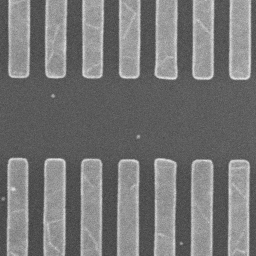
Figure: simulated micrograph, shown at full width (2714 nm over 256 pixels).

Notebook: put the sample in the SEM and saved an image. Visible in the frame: wiring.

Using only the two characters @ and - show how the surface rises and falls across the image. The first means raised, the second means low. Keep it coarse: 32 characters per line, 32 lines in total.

-@@@--@@--@@@--@@---@@--@@@--@@-
-@@@--@@--@@@--@@---@@--@@@--@@-
-@@@--@@--@@@--@@---@@--@@@--@@-
-@@@--@@--@@@--@@---@@--@@@--@@-
-@@@--@@--@@@--@@---@@--@@@--@@-
-@@@--@@--@@@--@@---@@--@@@--@@-
-@@@--@@--@@@--@@---@@--@@@--@@-
-@@@--@@--@@@--@@---@@--@@@--@@-
-@@@--@@--@@@--@@--@@@--@@@--@@-
--@---@@---@---@@---@@--@@---@@-
--------------------------------
--------------------------------
--------------------------------
--------------------------------
--------------------------------
--------------------------------
--------------------------------
--------------------------------
--------------------------------
--------------------------------
-@@---@@--@@@--@@--@@@--@@---@@-
-@@---@@--@@@--@@--@@@--@@@--@@-
-@@---@@--@@@--@@--@@@--@@@--@@-
-@@---@@--@@@--@@--@@@--@@@--@@-
-@@---@@--@@@--@@--@@@--@@@--@@-
-@@---@@--@@@--@@--@@@--@@---@@-
-@@---@@--@@@--@@--@@@--@@---@@-
-@@---@@--@@@--@@--@@@--@@---@@-
-@@---@@--@@@--@@--@@@--@@---@@-
-@@---@@--@@@--@@--@@@--@@---@@-
-@@---@@--@@@--@@--@@@--@@---@@-
-@@---@@--@@@--@@--@@@--@@---@@-